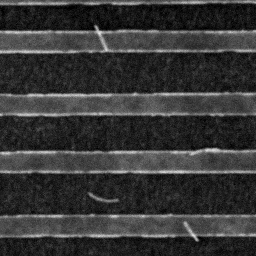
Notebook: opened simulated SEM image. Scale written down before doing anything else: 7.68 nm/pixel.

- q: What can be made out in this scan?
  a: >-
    lines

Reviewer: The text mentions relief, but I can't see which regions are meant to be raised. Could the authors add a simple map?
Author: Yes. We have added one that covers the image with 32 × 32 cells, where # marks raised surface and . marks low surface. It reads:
#########.###.####..............
................................
................................
................................
################################
################################
##########.##...................
................................
................................
................................
................................
................................
################################
################################
................................
................................
................................
................................
................................
################################
################################
################################
................................
................................
................................
................................
................................
################################
################################
#####.#########...####..#.......
................................
................................